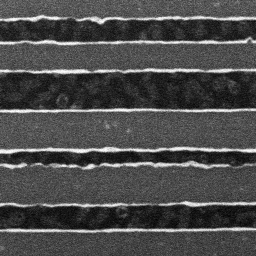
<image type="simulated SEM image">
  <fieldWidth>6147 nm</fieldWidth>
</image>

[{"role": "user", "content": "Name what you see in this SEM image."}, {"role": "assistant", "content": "one or a few lines or trenches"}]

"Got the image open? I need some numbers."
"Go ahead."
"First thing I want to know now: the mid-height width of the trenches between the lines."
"924 nanometres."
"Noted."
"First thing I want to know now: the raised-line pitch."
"1.49 µm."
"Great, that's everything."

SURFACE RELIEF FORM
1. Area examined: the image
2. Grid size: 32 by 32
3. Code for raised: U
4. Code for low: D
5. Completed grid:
DDDDDDDDDDDDDDDDDDDDDDDDDDDDDDDD
DDDDDDDDDDDDDDDDDDDDDDDDDDDDDDDD
UUUUUUUUUUUUDUUUUUUUUUUUUUUUUUUU
UUUUUUUUUUUUUUUUUUUUUUUUUUUUUUUU
UUUUUUUUUUUUUUUUUUUUUUUUUUUUUUUU
DDDDDDDDDDDDDDDDDDDDDDDDDDDDDDDD
DDDDDDDDDDDDDDDDDDDDDDDDDDDDDDDD
DDDDDDDDDDDDDDDDDDDDDDDDDDDDDDDD
DDDDDDDDDDDDDDDDDDDDDDDDDDDDDDDD
UUUUUUUUUUUUUUUUUUUUUUUUUUUUUUUU
UUUUUUUUUUUUUUUUUUUUUUUUUUUUUUUU
UUUUUUUUUUUUUUUUUUUUUUUUUUUUUUUU
UUUUUUUUUUUUUUUUUUUUUUUUUUUUUUUU
UUUUUUUUUUUUUUUUUUUUUUUUUUUUUUUU
DDDDDDDDDDDDDDDDDDDDDDDDDDDDDDDD
DDDDDDDDDDDDDDDDDDDDDDDDDDDDDDDD
DDDDDDDDDDDDDDDDDDDDDDDDDDDDDDDD
DDDDDDDDDDDDDDDDDDDDDDDDDDDDDDDD
DDDDDDDDDDDDDDDDDDDDDDDDDDDDDDDD
UUUUUUUUUUUUUUUUUUUUUUUUUUUUUUUU
UUUUUUUUUUUUUUUUUDDDUUDDUUUUUUUU
DDDDDDDDDDDDDDDDDDDDDDDDDDDDDDDD
DDDDDDDDDDDDDDDDDDDDDDDDDDDDDDDD
DDDDDDDDDDDDDDDDDDDDDDDDDDDDDDDD
DDDDDDDDDDDDDDDDDDDDDDDDDDDDDDDD
DDDDUDDDDDDDDDDDDDDDDDUDDDUUUUUU
UUUUUUUUUUUUUUUUUUUUUUUUUUUUUUUU
UUUUUUUUUUUUUUUUUUUUUUUUUUUUUUUU
UUUUUUUUUUUUUUUUUUUUUUUUUUUUUUUU
DDDDDDDDDDDDDDDDDDDDDDDDDDDDDDDD
DDDDDDDDDDDDDDDDDDDDDDDDDDDDDDDD
DDDDDDDDDDDDDDDDDDDDDDDDDDDDDDDD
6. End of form